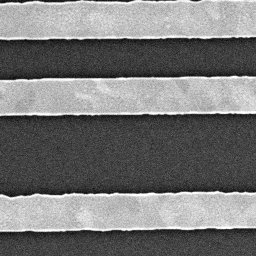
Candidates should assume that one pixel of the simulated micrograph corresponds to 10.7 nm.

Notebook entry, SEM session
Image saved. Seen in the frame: lines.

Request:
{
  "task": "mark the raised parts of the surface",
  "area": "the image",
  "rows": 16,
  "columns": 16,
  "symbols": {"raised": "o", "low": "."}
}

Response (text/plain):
oooooooooooooooo
oooooooooooooooo
................
................
................
oooooooooooooooo
oooooooooooooooo
................
................
................
................
................
oooooooooooooooo
oooooooooooooooo
................
................